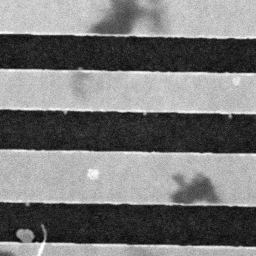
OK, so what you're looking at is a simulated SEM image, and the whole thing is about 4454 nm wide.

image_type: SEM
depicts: lines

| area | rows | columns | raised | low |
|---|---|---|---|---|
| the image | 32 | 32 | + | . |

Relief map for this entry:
++++++++++++++++++++++++++++++++
++++++++++++++++++++++++++++++++
++++++++++++++++++++++++++++++++
++++++++++++++++++++++++++++++++
..............++.+++++++++++++++
................................
................................
................................
................................
++++++++++++++++++++++++++++++++
++++++++++++++++++++++++++++++++
++++++++++++++++++++++++++++++++
++++++++++++++++++++++++++++++++
++++++++++++++++++++++++++++++++
................................
................................
................................
................................
................................
++++++++++++++++++++++++++++++++
++++++++++++++++++++++++++++++++
++++++++++++++++++++++++++++++++
++++++++++++++++++++++++++++++++
++++++++++++++++++++++++++++++++
++++++++++++++++++++++++++++++++
....................++++++++++++
................................
................................
................................
................................
++++++++++......................
++++++++++++++++++++++++++++++++